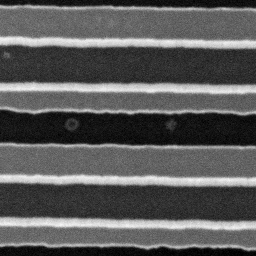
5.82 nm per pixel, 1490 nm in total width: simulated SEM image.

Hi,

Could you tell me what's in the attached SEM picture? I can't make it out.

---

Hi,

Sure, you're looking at lines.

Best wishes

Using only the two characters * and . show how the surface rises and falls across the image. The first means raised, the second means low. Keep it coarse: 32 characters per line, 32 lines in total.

................................
********************************
********************************
********************************
********************************
................................
................................
................................
................................
................................
................................
********************************
********************************
********************************
................................
................................
................................
................................
********************************
********************************
********************************
********************************
.....................***********
................................
................................
................................
................................
................................
********************************
********************************
********************************
................................